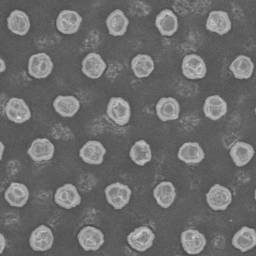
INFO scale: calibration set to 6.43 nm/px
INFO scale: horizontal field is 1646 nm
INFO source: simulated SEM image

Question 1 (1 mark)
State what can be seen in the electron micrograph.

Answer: a regular array of raised bodies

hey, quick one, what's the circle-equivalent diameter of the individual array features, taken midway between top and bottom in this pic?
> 22.2 px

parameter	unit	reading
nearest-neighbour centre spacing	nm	310